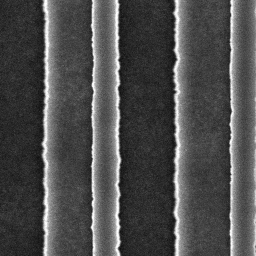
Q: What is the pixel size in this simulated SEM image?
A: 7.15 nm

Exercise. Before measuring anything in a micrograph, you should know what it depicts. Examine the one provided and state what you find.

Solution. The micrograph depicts lines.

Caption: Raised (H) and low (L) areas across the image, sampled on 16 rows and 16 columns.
LLLHHHHLLLLHHHHH
LLLHHHHLLLLHHHHH
LLLHHHHLLLLHHHHH
LLLHHHHLLLLHHHHH
LLLHHHHLLLLHHHHH
LLLHHHHLLLLHHHHH
LLLHHHHLLLLHHHHH
LLLHHHHLLLLHHHHH
LLLHHHHLLLLHHHHH
LLLHHHHLLLLHHHHH
LLLHHHHLLLLHHHHH
LLLHHHHLLLLHHHHH
LLLHHHHLLLLHHHHH
LLLHHHHLLLLHHHHH
LLLHHHHLLLLHHHHH
LLLHHHHLLLLHHHHH